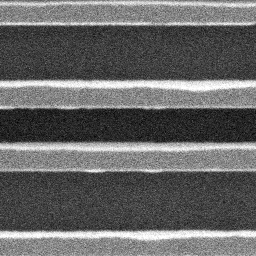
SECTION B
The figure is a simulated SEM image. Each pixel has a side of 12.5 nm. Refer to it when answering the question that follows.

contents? lines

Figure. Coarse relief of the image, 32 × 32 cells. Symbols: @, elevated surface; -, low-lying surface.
@@@@@@@@@@@@@@@@@@@@@@@@@@@@@@@@
@@@@@@@@@@@@@@@@@@@@@@@@@@@@@@@@
@@@@@@@@@@@@@@@@@@@@@@@@@@@@@@@@
--------------------------------
--------------------------------
--------------------------------
--------------------------------
--------------------------------
--------------------------------
--------------------------------
--@@@@@---------@@@------------@
@@@@@@@@@@@@@@@@@@@@@@@@@@@@@@@@
@@@@@@@@@@@@@@@@@@@@@@@@@@@@@@@@
@@-----@@@--------@@@-----------
--------------------------------
--------------------------------
--------------------------------
--------------------------------
@@@@@@@@@@@@@@@@@@@@@@@@@@@@@@@@
@@@@@@@@@@@@@@@@@@@@@@@@@@@@@@@@
@@@@@@@@@@@@@@@@@@@@@@@@@@@@@@@@
--------------------------------
--------------------------------
--------------------------------
--------------------------------
--------------------------------
--------------------------------
--------------------------------
--------------------------------
@@@@@@@@@@@@@@@@@@@@@@@@@@@@@@@@
@@@@@@@@@@@@@@@@@@@@@@@@@@@@@@@@
@@@@@@@@@@@@@@@@@@@@@@@@@@@@@@@@